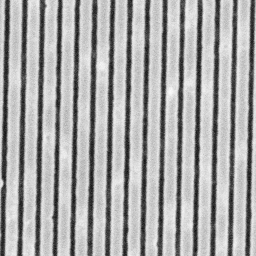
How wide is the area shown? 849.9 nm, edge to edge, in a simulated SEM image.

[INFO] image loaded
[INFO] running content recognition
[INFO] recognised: parallel lines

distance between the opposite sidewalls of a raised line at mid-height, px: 11.5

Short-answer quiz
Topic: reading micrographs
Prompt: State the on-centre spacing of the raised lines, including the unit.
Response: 58.2 nm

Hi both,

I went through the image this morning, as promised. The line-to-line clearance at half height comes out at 19.1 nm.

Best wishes